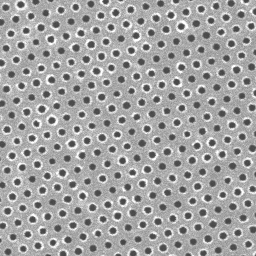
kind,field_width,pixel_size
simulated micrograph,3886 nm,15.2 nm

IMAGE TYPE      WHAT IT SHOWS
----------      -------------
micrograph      a regular array of holes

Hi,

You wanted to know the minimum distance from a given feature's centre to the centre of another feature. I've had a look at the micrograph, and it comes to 230 nanometres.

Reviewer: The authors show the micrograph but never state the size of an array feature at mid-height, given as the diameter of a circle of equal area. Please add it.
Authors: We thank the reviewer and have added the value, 114 nm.